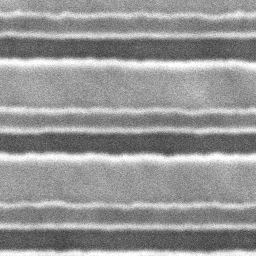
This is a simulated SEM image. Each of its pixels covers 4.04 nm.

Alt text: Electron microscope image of lines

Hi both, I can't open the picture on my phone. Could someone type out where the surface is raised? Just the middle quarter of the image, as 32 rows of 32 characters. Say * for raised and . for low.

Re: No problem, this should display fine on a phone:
********************************
********************************
********************************
********************************
********************************
********************************
********************************
********************************
********************************
********************************
********************************
********************************
********************************
********************************
********************************
********************************
**.*****************************
................................
................................
................................
................................
................................
................................
*************************.******
********************************
********************************
********************************
********************************
********************************
********************************
********************************
********************************